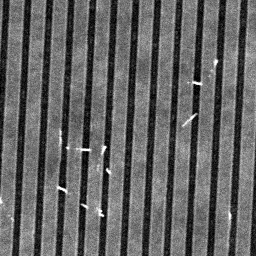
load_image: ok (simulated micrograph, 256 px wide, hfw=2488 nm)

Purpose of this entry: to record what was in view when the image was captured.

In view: parallel lines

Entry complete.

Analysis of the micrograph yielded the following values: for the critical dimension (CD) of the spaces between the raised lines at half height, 83.7 nanometers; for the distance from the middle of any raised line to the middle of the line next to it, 210 nanometers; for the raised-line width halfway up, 0.13 um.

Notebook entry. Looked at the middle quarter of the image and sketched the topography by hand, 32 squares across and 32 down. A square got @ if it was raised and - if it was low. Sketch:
--@@@---@@@--@@@--@@@---@@@--@@@
--@@@---@@@--@@@--@@@---@@@--@@@
--@@@--@@@@--@@@--@@@---@@@--@@@
--@@@--@@@@--@@@--@@@--@@@@--@@@
--@@@--@@@@--@@@--@@@--@@@@--@@@
--@@@--@@@---@@@--@@@--@@@@--@@@
--@@@--@@@---@@@--@@@---@@@--@@@
--@@@--@@@---@@@--@@@---@@@--@@@
--@@@--@@@--@@@@--@@@--@@@@--@@@
--@@@--@@@--@@@@--@@@--@@@@--@@@
--@@@--@@@--@@@@--@@@--@@@---@@@
--@@@--@@@---@@---@@@--@@@---@@@
--@@@--@@@--@@@---@@@--@@@---@@@
-@@@@--@@@--@@@---@@@--@@@--@@@@
-@@@@--@@@--@@@---@@@--@@@--@@@@
-@@@---@@@--@@@---@@@--@@@--@@@@
-@@@---@@@--@@@---@@@--@@@--@@@-
-@@@---@@@--@@@---@@@--@@@--@@@-
-@@@---@@@--@@@--@@@@--@@@--@@@-
-@@@---@@@--@@@--@@@@--@@@--@@@-
-@@@---@@@--@@@--@@@@--@@@--@@@-
-@@@@-@@@@--@@@--@@@---@@@--@@@-
-@@@---@@@--@@@--@@@---@@@--@@@-
-@@@--@@@@--@@@--@@@--@@@@--@@@-
-@@@--@@@@--@@@--@@@--@@@@--@@@-
-@@@--@@@@--@@@--@@@--@@@@--@@@-
-@@@--@@@--@@@@--@@@--@@@@--@@@-
-@@@--@@@--@@@@--@@@--@@@@--@@@-
-@@@--@@@--@@@@--@@@--@@@@--@@@-
-@@@--@@@--@@@@--@@@--@@@@--@@@-
-@@@--@@@--@@@@--@@@--@@@@--@@@-
@@@@--@@@--@@@---@@@--@@@---@@@-